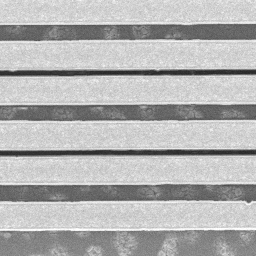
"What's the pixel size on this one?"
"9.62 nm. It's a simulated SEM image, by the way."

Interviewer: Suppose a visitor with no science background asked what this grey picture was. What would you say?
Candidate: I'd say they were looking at parallel lines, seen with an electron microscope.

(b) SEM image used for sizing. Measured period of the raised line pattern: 386 nm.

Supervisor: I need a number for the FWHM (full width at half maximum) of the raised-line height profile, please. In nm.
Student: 268